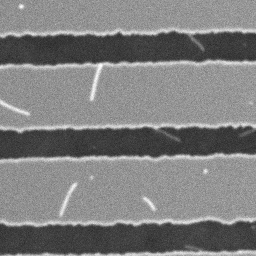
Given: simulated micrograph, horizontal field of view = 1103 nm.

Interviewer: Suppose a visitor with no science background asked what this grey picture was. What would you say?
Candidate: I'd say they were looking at lines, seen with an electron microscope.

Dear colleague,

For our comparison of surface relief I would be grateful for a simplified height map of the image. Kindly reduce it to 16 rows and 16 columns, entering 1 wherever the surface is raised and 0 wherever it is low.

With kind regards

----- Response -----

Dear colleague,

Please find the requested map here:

1111111111111111
1111111111111111
0000000000000000
0000000000000000
1111111111111111
1111111111111111
1111111111111111
1111111111111111
0000000000000000
0000000000000000
1111111111111111
1111111111111111
1111111111111111
1111111111111111
0000000000000000
0000000000000000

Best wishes